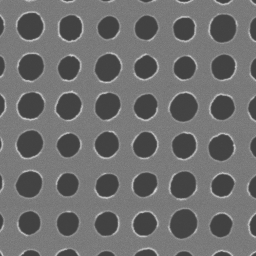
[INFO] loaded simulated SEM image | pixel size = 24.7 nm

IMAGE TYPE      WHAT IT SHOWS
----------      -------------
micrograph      a regular array of holes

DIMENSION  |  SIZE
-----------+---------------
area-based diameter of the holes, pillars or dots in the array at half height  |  0.609 micrometres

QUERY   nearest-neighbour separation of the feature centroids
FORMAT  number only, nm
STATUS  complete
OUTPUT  941